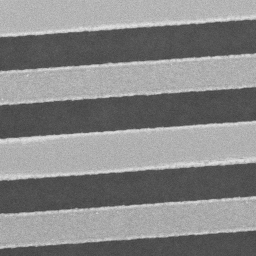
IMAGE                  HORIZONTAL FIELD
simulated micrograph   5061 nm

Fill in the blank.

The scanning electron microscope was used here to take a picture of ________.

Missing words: lines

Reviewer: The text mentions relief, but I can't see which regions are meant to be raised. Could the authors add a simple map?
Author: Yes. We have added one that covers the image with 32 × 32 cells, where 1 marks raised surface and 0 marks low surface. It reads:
11111111111111111111111111111111
11111111111111111111111111111111
11111111111111111111111111111110
11111111111111100000000000000000
10000000000000000000000000000000
00000000000000000000000000000000
00000000000000000000000000000000
00000000000000000000000111111111
00000001111111111111111111111111
11111111111111111111111111111111
11111111111111111111111111111111
11111111111111111111110000000000
11111111000000000000000000000000
00000000000000000000000000000000
00000000000000000000000000000000
00000000000000000000000000001111
00000000000001111111111111111111
11111111111111111111111111111111
11111111111111111111111111111111
11111111111111111111111111111111
11111111111111111111111111111000
11111111111111000000000000000000
00000000000000000000000000000000
00000000000000000000000000000000
00000000000000000000000000000000
00000000000000000000111111111111
00000011111111111111111111111111
11111111111111111111111111111111
11111111111111111111111111111111
11111111111111111111100000000000
11111111000000000000000000000000
00000000000000000000000000000000